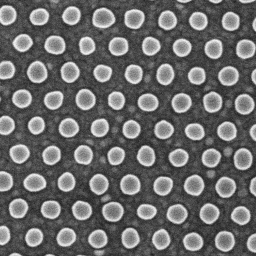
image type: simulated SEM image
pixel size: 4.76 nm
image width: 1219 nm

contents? a regular array of raised bodies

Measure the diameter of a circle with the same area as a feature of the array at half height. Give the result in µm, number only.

0.0887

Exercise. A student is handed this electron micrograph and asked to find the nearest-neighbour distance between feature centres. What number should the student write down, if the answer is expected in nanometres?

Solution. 146